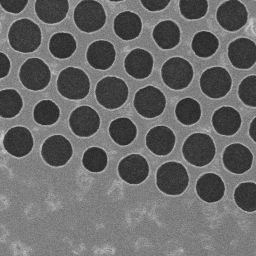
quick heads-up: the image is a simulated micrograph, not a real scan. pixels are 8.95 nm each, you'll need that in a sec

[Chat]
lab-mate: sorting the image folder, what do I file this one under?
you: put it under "a regular array of holes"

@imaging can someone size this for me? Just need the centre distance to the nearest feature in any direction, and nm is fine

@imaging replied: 351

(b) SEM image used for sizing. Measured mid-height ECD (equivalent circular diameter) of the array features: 270 nm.